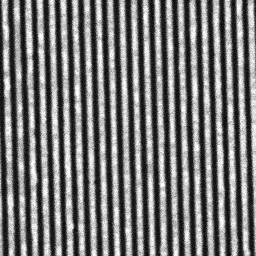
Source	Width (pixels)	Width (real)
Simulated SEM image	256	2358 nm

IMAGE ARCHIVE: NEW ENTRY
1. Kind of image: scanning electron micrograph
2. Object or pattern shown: parallel lines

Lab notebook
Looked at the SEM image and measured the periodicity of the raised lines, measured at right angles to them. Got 108 nm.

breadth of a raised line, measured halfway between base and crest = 57.5 nm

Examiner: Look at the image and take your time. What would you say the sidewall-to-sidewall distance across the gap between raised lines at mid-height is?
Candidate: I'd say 0.0506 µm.